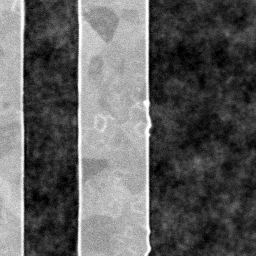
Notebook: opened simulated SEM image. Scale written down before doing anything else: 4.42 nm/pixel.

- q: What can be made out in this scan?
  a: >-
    one or a few lines or trenches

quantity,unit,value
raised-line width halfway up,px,68.7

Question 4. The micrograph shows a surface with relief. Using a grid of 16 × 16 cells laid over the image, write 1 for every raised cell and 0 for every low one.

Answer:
1000011110000000
1000011110000000
1000011110000000
1000011110000000
1000011110000000
1000011110000000
1000011110000000
1000011110000000
1000011110000000
1000011110000000
1000011110000000
1000011110000000
1000011110000000
1000011110000000
1000011110000000
1000011110000000